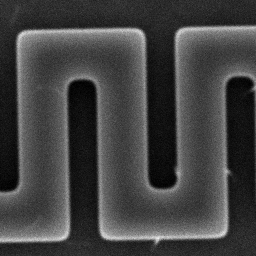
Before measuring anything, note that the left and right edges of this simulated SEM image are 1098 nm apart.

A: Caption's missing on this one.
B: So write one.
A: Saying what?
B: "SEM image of groups of lines, slits or small figures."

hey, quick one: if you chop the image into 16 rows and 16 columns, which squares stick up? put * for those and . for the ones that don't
................
................
.********..*****
.********..*****
.********..*****
.***..***..***..
.***..***..***..
.***..***..***..
.***..***..***..
.***..***..***..
.***..***..***..
.***..***..***..
****..********..
****..********..
****..********..
................